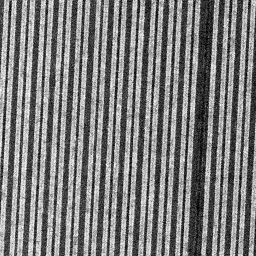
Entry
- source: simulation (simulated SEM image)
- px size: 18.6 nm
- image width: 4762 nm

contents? parallel lines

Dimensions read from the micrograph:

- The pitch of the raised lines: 170 nm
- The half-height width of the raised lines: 4.49 pixels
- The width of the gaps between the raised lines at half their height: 67.3 nanometers